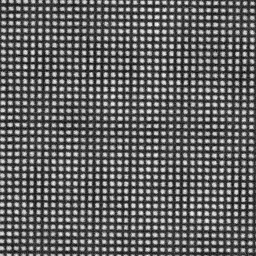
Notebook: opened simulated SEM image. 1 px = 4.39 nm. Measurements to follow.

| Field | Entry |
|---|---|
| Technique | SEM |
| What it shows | a regular array of raised bodies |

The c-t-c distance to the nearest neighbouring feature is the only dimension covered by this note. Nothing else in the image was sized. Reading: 30.8 nanometres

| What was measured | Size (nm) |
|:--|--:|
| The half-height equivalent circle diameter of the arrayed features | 19.8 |